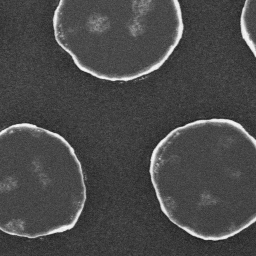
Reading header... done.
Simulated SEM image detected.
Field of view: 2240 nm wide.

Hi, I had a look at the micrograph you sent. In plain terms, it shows raised bodies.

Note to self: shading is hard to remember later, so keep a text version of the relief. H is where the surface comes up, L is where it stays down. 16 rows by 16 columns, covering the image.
LLLLHHHHHHHLLLLH
LLLHHHHHHHHLLLLH
LLLLHHHHHHHLLLLH
LLLLHHHHHHLLLLLL
LLLLLHHHHLLLLLLL
LLLLLLLLLLLLLLLL
LLLLLLLLLLLLLLLL
LLLLLLLLLLLLLHLL
HHHHLLLLLLHHHHHH
HHHHHLLLLLHHHHHH
HHHHHLLLLHHHHHHH
HHHHHLLLLLHHHHHH
HHHHHLLLLLHHHHHH
HHHHHLLLLLLHHHHH
HHHLLLLLLLLLHHHL
LLLLLLLLLLLLLLLL